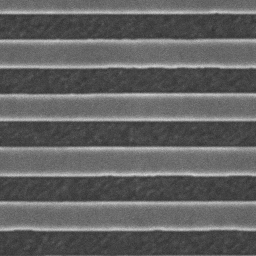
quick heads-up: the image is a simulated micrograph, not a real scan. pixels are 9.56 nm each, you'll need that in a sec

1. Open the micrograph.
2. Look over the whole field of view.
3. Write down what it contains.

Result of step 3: lines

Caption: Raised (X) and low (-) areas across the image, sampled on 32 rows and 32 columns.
XXXXXXXXXXXXXXXXXXXXXXXXXXXXXXXX
XXXXXXXXXXXXXXXXXXXXXXXXXXXXXXXX
--------------------------------
--------------------------------
--------------------------------
XXXXXXXXXXXXXXXXXXXXXXXXXXXXXXXX
XXXXXXXXXXXXXXXXXXXXXXXXXXXXXXXX
XXXXXXXXXXXXXXXXXXXXXXXXXXXXXXXX
--------------------------------
--------------------------------
--------------------------------
--------------------------------
XXXXXXXXXXXXXXXXXXXXXXXXXXXXXXXX
XXXXXXXXXXXXXXXXXXXXXXXXXXXXXXXX
XXXXXXXXXXXXXXXXXXXXXXXXXXXXXXXX
--------------------------------
--------------------------------
--------------------------------
XXXXXXXXXXXXXXXXXXXXXXXXXXXXXXXX
XXXXXXXXXXXXXXXXXXXXXXXXXXXXXXXX
XXXXXXXXXXXXXXXXXXXXXXXXXXXXXXXX
XXXXXXXXXXXXXXXXXXXXXXXXXXXXXXXX
--------------------------------
--------------------------------
--------------------------------
XXXXXXXXXXXXXXXXXXXXXXXXXXXXXXXX
XXXXXXXXXXXXXXXXXXXXXXXXXXXXXXXX
XXXXXXXXXXXXXXXXXXXXXXXXXXXXXXXX
XXXXXXXXXXXXXXXXXXXXXXXXXXXXXXXX
--------------------------------
--------------------------------
--------------------------------